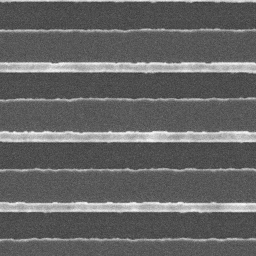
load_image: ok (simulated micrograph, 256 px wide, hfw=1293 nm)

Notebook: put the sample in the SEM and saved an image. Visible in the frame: lines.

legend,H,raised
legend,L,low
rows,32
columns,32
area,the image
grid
LLLLLLLLLLLLLLLLLLLLLLLLLLLLLLLL
LLLLLLLLLLLLLLLLLLLLLLLLLLLLLLLL
LLLLLLLLLLLLLLLLLLLLLLLLLLLLLLLL
LLLLLLLLLLLLLLLLLLLLLLLLLLLLLLLL
HHHHHHHHHHHHHHHHHHHHHHHHHHHHHHHH
HHHHHHHHHHHHHHHHHHHHHHHHHHHHHHHH
HHHHHHHHHHHHHHHHHHHHHHHHHHHHHHHH
HHHHHHHHHHHHHHHHHHHHHHHHHHHHHHHH
HHHHHHHHHHHHHHHHHHHHHHHHHHHHHHHH
LLLLLLLLLLLLLLLLLLLLLLLLLLLLLLLL
LLLLLLLLLLLLLLLLLLLLLLLLLLLLLLLL
LLLLLLLLLLLLLLLLLLLLLLLLLLLLLLLL
LHHHHHHHHHHHHHHHHHHHHHHHHHHHHHHH
HHHHHHHHHHHHHHHHHHHHHHHHHHHHHHHH
HHHHHHHHHHHHHHHHHHHHHHHHHHHHHHHH
HHHHHHHHHHHHHHHHHHHHHHHHHHHHHHHH
HHHHHHHHHHHHHHHHHHHHHHHHHHHHHHHH
HHHHHHHHHHHHHHHHHHHHHHHHHHHHHHHH
LLLLLLLLLLLLLLLLLLLLLLLLLLLLLLLL
LLLLLLLLLLLLLLLLLLLLLLLLLLLLLLLL
LLLLLLLLLLLLLLLLLLLLLLLLLLLLLLLL
HHHHHHHHHHHHHHHHHHHHHHHHHHHHHHHH
HHHHHHHHHHHHHHHHHHHHHHHHHHHHHHHH
HHHHHHHHHHHHHHHHHHHHHHHHHHHHHHHH
HHHHHHHHHHHHHHHHHHHHHHHHHHHHHHHH
HHHHHHHHHHHHHHHHHHHHHHHHHHHHHHHH
LLLLLLLLLLLLLLLLLLLLLLLLLLLLLLLL
LLLLLLLLLLLLLLLLLLLLLLLLLLLLLLLL
LLLLLLLLLLLLLLLLLLLLLLLLLLLLLLLL
LLLLLLLLLLLLLLLLLLLLLLLLLLLLLLLL
HHHHHHHHHHHHHHHHHHHHHHHHHHHHHHHH
HHHHHHHHHHHHHHHHHHHHHHHHHHHHHHHH